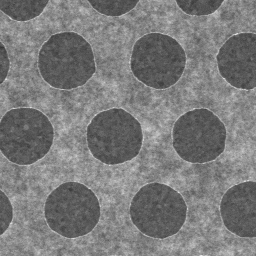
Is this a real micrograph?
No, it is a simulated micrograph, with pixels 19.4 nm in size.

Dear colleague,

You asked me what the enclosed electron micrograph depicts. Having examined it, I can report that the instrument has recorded raised bodies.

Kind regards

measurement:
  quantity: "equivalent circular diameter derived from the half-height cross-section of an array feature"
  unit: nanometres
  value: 1100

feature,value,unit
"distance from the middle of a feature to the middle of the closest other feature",1.65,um